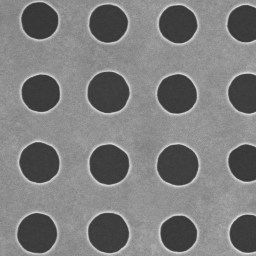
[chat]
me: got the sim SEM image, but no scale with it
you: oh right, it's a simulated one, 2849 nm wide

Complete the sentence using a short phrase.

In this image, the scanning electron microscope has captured a regular array of holes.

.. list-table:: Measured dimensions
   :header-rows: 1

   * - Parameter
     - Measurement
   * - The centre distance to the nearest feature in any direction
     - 68.6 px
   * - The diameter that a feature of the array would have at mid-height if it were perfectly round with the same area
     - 0.441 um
